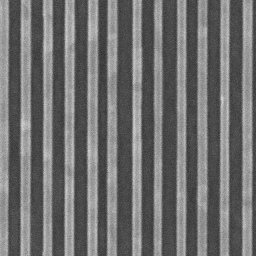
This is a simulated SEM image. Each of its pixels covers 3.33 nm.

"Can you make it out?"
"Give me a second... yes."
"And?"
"parallel lines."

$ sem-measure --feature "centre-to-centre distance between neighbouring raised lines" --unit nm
73.8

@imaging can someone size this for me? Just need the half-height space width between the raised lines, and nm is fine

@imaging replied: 46.2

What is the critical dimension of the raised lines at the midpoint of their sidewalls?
28.7 nanometers